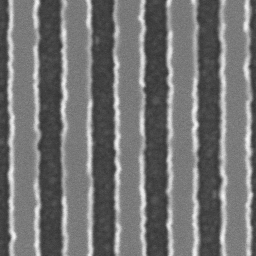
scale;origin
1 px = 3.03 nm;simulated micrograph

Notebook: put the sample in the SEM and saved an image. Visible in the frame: parallel lines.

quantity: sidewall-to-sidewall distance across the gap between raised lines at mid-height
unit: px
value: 23.6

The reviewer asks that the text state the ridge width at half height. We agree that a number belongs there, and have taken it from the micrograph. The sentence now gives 88.9 nm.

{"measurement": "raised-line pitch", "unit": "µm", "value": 0.16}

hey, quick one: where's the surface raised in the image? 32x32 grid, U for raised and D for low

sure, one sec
DUUUUDDDUUUDDDUUUUDDDUUUUDDDUUUD
DUUUUDDDUUUDDDUUUUDDDUUUUDDDUUUD
DUUUUDDDUUUDDDUUUUDDDUUUUDDDUUUD
DUUUUDDDUUUDDDUUUUDDDUUUUDDUUUUD
DUUUUDDDUUUDDDUUUUDDDUUUUDDUUUUD
DUUUUDDDUUUDDDUUUUDDDUUUUDDDUUUD
DUUUUDDDUUUDDDUUUUDDDUUUUDDDUUUD
DUUUUDDDUUUDDDUUUUDDDUUUUDDDUUUD
DUUUUDDDUUUDDDUUUUDDDUUUUDDDUUUD
DUUUUDDDUUUDDDUUUUDDDUUUUDDDUUUD
DUUUUDDDUUUDDDUUUUDDDUUUUDDDUUUD
DUUUUDDDUUUDDDUUUUDDDUUUUDDDUUUD
DUUUUDDDUUUDDDUUUUDDDUUUUDDDUUUD
DUUUUDDDUUUDDDUUUUDDDUUUUDDDUUUD
DUUUUDDDUUUDDDUUUUDDDUUUUDDDUUUD
DUUUUDDDUUUDDDUUUUDDDUUUUDDDUUUD
DUUUUDDDUUUDDDUUUUDDDUUUUDDDUUUD
DUUUUDDDUUUDDDUUUUDDDUUUUDDDUUUD
DUUUUDDDUUUDDDUUUUDDDUUUUDDDUUUD
DUUUUDDDUUUDDDUUUUDDDUUUUDDDUUUD
DUUUUDDDUUUDDDUUUUDDDUUUUDDDUUUD
DUUUUDDDUUUDDDDUUUDDDUUUUDDDUUUD
DUUUUDDDUUUUDDUUUUDDDUUUUDDDUUUD
DUUUUDDDUUUUDDUUUUDDDUUUUDDDUUUD
DUUUUDDDUUUUDDUUUUDDDUUUUDDDUUUD
DUUUUDDDUUUUDDUUUUDDDUUUUDDDUUUD
DUUUUDDDUUUDDDUUUUDDDUUUUDDDUUUD
DUUUUDDDUUUDDDUUUUDDDUUUUDDDUUUD
DUUUUDDDUUUDDDDUUUDDDUUUUDDDUUUD
DUUUUDDDUUUDDDUUUUDDDUUUUDDDUUUD
DUUUUDDDUUUDDDUUUUDDDUUUUDDDUUUD
DUUUUDDDUUUUDDUUUUDDDUUUUDDDUUUD